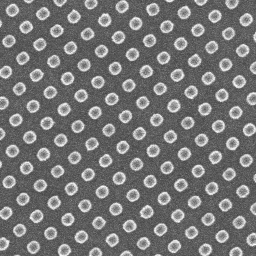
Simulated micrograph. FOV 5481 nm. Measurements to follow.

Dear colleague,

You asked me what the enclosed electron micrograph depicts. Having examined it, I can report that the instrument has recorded a regular array of raised bodies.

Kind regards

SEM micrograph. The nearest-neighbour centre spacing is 467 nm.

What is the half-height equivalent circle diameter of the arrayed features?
259 nanometers